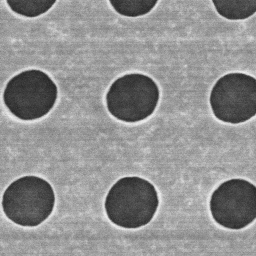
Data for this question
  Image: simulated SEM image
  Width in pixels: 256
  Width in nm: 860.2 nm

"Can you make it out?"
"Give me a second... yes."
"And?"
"holes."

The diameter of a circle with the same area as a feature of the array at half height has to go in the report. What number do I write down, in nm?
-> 178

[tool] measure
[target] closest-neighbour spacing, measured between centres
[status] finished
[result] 103 px